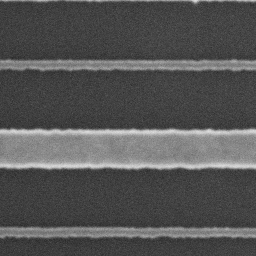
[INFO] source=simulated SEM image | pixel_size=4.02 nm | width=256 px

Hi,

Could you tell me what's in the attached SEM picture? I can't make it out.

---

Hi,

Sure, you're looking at lines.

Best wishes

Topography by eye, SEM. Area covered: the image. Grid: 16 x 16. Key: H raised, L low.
LLLLLLLLLLLLLLLL
LLLLLLLLLLLLLLLL
LLLLLLLLLLLLLLLL
LLLLLLLLLLLLLLLL
LLLLLLLLLLLLLLLL
LLLLLLLLLLLLLLLL
LLLLLLLLLLLLLLLL
LLLLLLLLLLLLLLLL
HHHHHHHHHHHHHHHH
HHHHHHHHHHHHHHHH
LLLLLLLLLLLLLLLL
LLLLLLLLLLLLLLLL
LLLLLLLLLLLLLLLL
LLLLLLLLLLLLLLLL
LLLLLLLLLLLLLLLL
LLLLLLLLLLLLLLLL